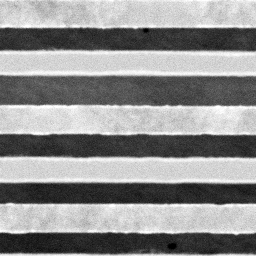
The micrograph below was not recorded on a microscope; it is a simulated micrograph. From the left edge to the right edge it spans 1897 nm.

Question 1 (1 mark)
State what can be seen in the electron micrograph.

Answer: lines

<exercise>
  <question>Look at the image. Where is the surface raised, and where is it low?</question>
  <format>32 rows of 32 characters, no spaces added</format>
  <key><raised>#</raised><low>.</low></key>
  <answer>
################################
################################
################################
................................
................................
................................
##############################..
################################
################################
................................
................................
................................
................................
################################
################################
################################
################################
................................
................................
................................
################################
################################
################################
................................
................................
##..............................
################################
################################
################################
................................
................................
................................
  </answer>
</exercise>